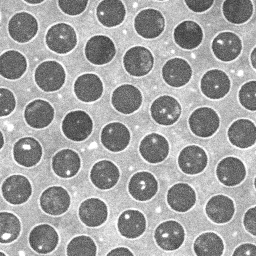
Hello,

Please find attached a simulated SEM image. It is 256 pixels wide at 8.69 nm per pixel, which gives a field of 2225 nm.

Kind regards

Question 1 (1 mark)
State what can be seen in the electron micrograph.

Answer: a regular array of holes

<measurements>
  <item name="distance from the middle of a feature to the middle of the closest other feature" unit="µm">0.342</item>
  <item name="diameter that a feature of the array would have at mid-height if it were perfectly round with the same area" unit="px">30.8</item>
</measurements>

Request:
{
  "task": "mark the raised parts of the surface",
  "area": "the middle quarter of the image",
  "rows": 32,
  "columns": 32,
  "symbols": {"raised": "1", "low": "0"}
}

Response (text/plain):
11111111111111100000001110000000
11111111111111100000001100000000
01111000111111110000011100000000
11100000011111111111111110000000
11100000011111111111111110000001
11000000001111000111111111000011
11000000001100000001111111111111
11100000001100000001111111111111
11100000011100000000111000001111
11111001111100000000110000000111
11111111111100000001110000000111
11101111111110000011100000000111
10000011111111100111110000000111
00000001111111111111110000000110
00000001111100111111111000001110
00000001110000011111111110111110
00000001100000001111111111111111
00000001100000000111100011111111
10000011100000000111000001111111
11101111100000001110000000111111
11111111110000001110000000111110
00111111111000011110000000111000
00001111111111111110000000111000
00001111111111111111000000110000
00001111000011111111100011110000
00001110000001111111111111111000
00001110000000111111111111111000
00011100000000111000001111111110
00111100000000111000000111111111
11111110000000110000000111111111
11111111000001110000000011100000
01111111100111110000000011000000